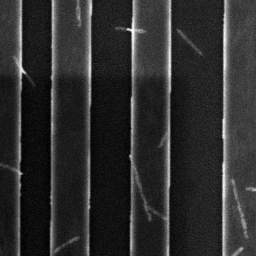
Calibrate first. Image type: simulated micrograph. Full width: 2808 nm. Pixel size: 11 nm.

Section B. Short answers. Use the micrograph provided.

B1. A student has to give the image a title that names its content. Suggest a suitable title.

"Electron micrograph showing lines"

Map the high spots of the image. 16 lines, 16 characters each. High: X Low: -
X--XXX--XXX---XX
X--XXX--XXX---XX
X--XXX--XXX---XX
X--XXX--XXX---XX
X--XXX--XXX---XX
X--XXX--XXX---XX
X--XXX--XXX---XX
X--XXX--XXX---XX
X--XXX--XXX---XX
X--XXX--XXX---XX
X--XXX--XXX---XX
X--XXX--XXX---XX
X--XXX--XXX---XX
X--XXX--XXX---XX
X--XXX--XXX---XX
X--XXX--XXX---XX